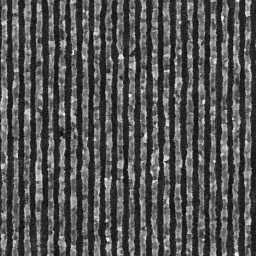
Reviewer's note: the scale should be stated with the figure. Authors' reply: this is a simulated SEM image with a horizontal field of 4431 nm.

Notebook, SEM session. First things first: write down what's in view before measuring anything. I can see parallel lines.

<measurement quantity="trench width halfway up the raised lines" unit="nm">110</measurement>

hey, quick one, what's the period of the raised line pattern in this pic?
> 201 nanometres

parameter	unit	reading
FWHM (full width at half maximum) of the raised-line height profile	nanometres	93